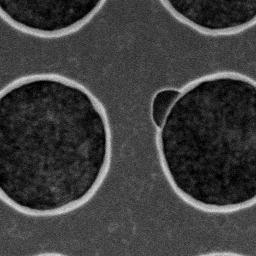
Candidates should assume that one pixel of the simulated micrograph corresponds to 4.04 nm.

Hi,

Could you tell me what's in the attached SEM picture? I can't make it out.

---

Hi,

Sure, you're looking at holes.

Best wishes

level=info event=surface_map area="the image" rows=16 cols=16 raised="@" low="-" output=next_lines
------@@@@@-----
@----@@@@@@@---@
@@@@@@@@@@@@@@@@
@@@@@@@@@@@@@@@@
@@@@@@@@@@@@@@@@
@----@@@@@@@----
------@@@@------
------@@@@------
-------@@@------
-------@@@------
------@@@@------
------@@@@@-----
@----@@@@@@@----
@@@@@@@@@@@@@@@@
@@@@@@@@@@@@@@@@
@@@@@@@@@@@@@@@@